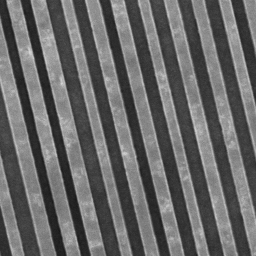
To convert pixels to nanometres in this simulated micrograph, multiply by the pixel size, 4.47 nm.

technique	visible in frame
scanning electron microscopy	parallel lines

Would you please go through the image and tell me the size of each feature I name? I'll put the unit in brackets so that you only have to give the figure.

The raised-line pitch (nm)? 115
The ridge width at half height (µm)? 0.0582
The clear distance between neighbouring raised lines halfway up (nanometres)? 58.8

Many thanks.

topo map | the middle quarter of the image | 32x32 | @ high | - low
---@@@---@@@@---@@@---@@@----@@@
----@@----@@@---@@@----@@----@@@
----@@----@@@---@@@----@@@---@@@
----@@@---@@@---@@@@---@@@----@@
----@@@---@@@---@@@@---@@@----@@
----@@@---@@@@---@@@----@@----@@
@----@@----@@@---@@@----@@----@@
@----@@----@@@---@@@----@@@----@
@----@@@---@@@---@@@@---@@@----@
@----@@@---@@@@---@@@----@@----@
@@----@@----@@@---@@@----@@----@
@@----@@----@@@---@@@----@@@----
@@----@@@---@@@---@@@@---@@@----
@@----@@@---@@@@---@@@----@@----
@@-----@@----@@@---@@@----@@----
@@@----@@----@@@---@@@----@@@---
@@@----@@@---@@@---@@@@---@@@---
@@@----@@@---@@@@---@@@---@@@---
@@@-----@@----@@@---@@@----@@---
@@@@----@@----@@@---@@@----@@@--
@@@@----@@@---@@@---@@@@---@@@--
-@@@----@@@---@@@@--@@@@---@@@--
-@@@----@@@---@@@@---@@@----@@--
-@@@@----@@----@@@---@@@----@@--
-@@@@----@@@---@@@---@@@----@@@-
-@@@@----@@@---@@@---@@@@---@@@-
--@@@----@@@---@@@@---@@@----@@-
--@@@@----@@----@@@---@@@----@@-
--@@@@----@@----@@@---@@@----@@@
--@@@@----@@@---@@@---@@@@---@@@
---@@@----@@@---@@@@---@@@----@@
---@@@@----@@----@@@---@@@----@@